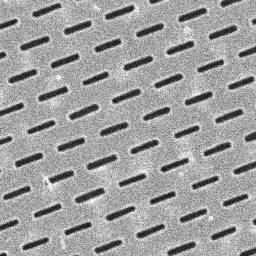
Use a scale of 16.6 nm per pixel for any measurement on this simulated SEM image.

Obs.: a regular array of holes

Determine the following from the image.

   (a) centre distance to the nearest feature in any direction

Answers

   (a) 0.579 um